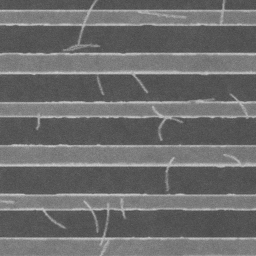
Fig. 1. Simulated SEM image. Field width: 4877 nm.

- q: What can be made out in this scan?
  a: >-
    lines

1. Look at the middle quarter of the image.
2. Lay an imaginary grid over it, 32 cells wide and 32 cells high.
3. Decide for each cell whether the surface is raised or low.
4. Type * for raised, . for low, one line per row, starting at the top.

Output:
********************************
********************************
.................*..............
................................
................................
................................
................................
................................
................................
*****..****..**.****************
********************************
********************************
********************************
.........................*......
................................
................................
................................
................................
................................
................................
********************************
********************************
********************************
********************************
********************************
.........................**.....
................................
................................
................................
................................
................................
................................